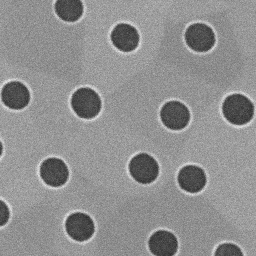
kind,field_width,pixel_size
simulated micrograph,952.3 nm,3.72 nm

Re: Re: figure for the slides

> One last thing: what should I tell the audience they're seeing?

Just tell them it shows a regular array of holes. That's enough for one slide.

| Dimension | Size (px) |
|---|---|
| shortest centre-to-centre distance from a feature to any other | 61.7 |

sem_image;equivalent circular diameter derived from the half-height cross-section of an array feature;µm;0.117